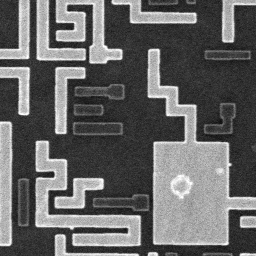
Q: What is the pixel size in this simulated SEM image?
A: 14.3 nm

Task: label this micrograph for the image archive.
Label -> wiring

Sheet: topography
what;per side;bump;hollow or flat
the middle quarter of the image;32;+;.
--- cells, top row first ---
.....................+++........
+++++................+++........
+++++................+++........
+++++................+++........
+....................+++........
+...........+++......+++........
+..++++++++++++......+++++++....
+..++++++++++++......+++++++....
+...........+++...........++....
+.........................++....
+..++++++.................++++++
+..+++++++................++++++
...++++++.................++++++
..............................++
..............................++
..++++++++++++................++
..++++++++++++................++
...+++++++++++................++
..............................++
..............................++
.......................+++++++++
.......................+++++++++
.......................+++++++++
.......................+++++++++
+......................+++++++++
+......................+++++++++
+......................+++++++++
+.....................++++++++++
+.....................++++++++++
+..+++++++............++++++++++
+..+++++++............++++++++++
...+++................++++++++++